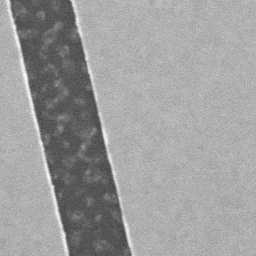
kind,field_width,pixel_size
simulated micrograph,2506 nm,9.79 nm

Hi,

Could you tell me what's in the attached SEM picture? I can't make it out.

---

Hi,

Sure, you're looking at one or a few lines or trenches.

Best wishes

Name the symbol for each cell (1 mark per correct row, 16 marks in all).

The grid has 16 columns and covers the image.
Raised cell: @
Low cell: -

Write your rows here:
@----@@@@@@@@@@@
@----@@@@@@@@@@@
@----@@@@@@@@@@@
@----@@@@@@@@@@@
@@----@@@@@@@@@@
@@----@@@@@@@@@@
@@----@@@@@@@@@@
@@----@@@@@@@@@@
@@@----@@@@@@@@@
@@@----@@@@@@@@@
@@@----@@@@@@@@@
@@@----@@@@@@@@@
@@@----@@@@@@@@@
@@@@----@@@@@@@@
@@@@----@@@@@@@@
@@@@----@@@@@@@@